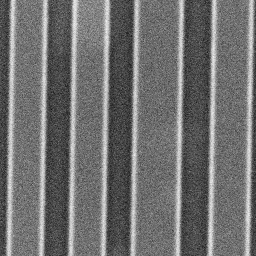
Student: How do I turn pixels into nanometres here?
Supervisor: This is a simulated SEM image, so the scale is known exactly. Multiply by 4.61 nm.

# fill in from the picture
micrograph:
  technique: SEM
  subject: groups of lines, slits or small figures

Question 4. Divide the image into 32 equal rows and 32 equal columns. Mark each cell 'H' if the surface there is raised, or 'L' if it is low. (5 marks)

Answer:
LLHHHHLLLHHHHHLLLHHHHHHLLLLHHHHH
LLHHHHLLLHHHHHLLLHHHHHHLLLLHHHHH
LLHHHHLLLHHHHHLLLHHHHHHLLLLHHHHH
LHHHHHLLLHHHHLLLLHHHHHHLLLLHHHHH
LHHHHHLLLHHHHLLLLHHHHHHLLLLHHHHL
LHHHHHLLLHHHHLLLLHHHHHHLLLLHHHHL
LHHHHHLLLHHHHLLLLHHHHHHLLLLHHHHL
LHHHHHLLLHHHHLLLLHHHHHHLLLLHHHHL
LHHHHHLLLHHHHLLLLHHHHHHLLLLHHHHL
LHHHHHLLLHHHHLLLLHHHHHHLLLLHHHHL
LHHHHHLLLHHHHLLLLHHHHHHLLLLHHHHL
LHHHHHLLLHHHHLLLLHHHHHHLLLLHHHHL
LHHHHHLLLHHHHLLLLHHHHHHLLLLHHHHL
LHHHHHLLLHHHHLLLLHHHHHHLLLLHHHHL
LHHHHHLLLHHHHLLLLHHHHHHLLLHHHHHL
LHHHHHLLLHHHHLLLLHHHHHHLLLHHHHHL
LHHHHHLLLHHHHLLLLHHHHHHLLLHHHHHL
LHHHHLLLLHHHHLLLLHHHHHLLLLHHHHHL
LHHHHLLLLHHHHLLLLHHHHHLLLLHHHHHL
LHHHHLLLLHHHHLLLLHHHHHLLLLHHHHHL
LHHHHLLLLHHHHLLLLHHHHHLLLLHHHHHL
LHHHHLLLLHHHHLLLLHHHHHLLLLHHHHHL
LHHHHLLLLHHHHLLLLHHHHHLLLLHHHHHL
LHHHHLLLLHHHHLLLLHHHHHLLLLHHHHHL
LHHHHLLLLHHHHLLLLHHHHHLLLLHHHHHL
LHHHHLLLLHHHHLLLLHHHHHLLLLHHHHHL
LHHHHLLLLHHHHLLLLHHHHHLLLLHHHHHL
LHHHHLLLLHHHHLLLLHHHHHLLLLHHHHHL
LHHHHLLLLHHHHLLLLHHHHHLLLLHHHHHL
LHHHHLLLLHHHHLLLLHHHHHLLLLHHHHHL
LHHHHLLLLHHHHLLLLHHHHHLLLLHHHHHL
LHHHHLLLLHHHHLLLLHHHHHLLLLHHHHHL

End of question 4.